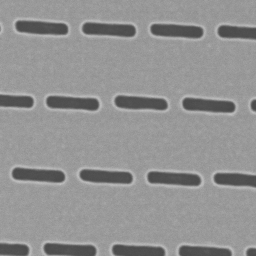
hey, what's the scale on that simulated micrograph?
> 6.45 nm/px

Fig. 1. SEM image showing a regular array of holes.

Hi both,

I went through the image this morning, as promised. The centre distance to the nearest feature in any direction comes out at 0.438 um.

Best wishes